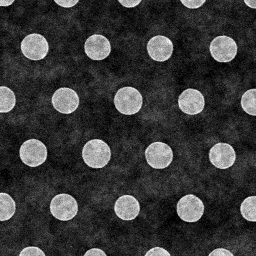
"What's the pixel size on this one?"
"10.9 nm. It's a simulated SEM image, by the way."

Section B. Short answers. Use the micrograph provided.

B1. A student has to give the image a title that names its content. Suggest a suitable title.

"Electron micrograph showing a regular array of raised bodies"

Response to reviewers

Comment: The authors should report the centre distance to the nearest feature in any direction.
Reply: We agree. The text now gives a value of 670 nm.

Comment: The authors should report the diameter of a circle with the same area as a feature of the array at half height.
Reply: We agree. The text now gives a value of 290 nm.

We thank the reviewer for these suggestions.